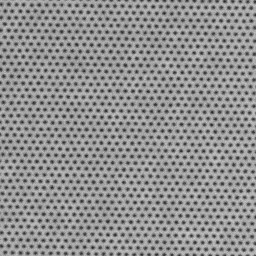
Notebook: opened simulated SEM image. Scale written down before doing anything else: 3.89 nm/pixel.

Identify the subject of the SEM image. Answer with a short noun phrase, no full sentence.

a regular array of holes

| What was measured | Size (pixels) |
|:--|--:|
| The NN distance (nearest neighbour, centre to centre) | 7.22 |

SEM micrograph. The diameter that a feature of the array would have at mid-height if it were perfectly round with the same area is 3.57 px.